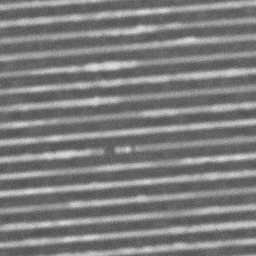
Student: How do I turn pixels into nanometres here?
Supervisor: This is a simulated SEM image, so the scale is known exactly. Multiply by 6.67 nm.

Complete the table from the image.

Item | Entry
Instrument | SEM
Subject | parallel lines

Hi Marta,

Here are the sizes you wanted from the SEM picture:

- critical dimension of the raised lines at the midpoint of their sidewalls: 0.0283 um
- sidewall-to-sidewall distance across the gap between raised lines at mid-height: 12.7 pixels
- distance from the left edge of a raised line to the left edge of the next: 0.113 µm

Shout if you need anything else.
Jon